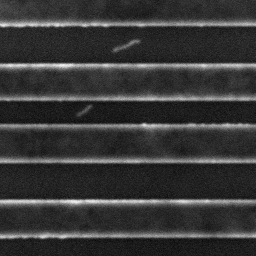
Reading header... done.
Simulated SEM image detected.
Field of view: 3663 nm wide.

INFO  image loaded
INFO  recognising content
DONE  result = lines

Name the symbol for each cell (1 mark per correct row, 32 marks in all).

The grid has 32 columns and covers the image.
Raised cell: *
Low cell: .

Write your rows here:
********************************
********************************
********************************
................................
................................
................................
................................
................................
********************************
********************************
********************************
********************************
................................
................................
................................
................................
********************************
********************************
********************************
********************************
................................
................................
................................
................................
................................
********************************
********************************
********************************
********************************
********************************
................................
................................